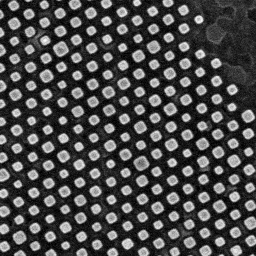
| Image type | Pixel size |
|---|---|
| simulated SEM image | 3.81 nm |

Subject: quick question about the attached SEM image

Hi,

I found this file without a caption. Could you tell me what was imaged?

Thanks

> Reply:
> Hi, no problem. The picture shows a regular array of raised bodies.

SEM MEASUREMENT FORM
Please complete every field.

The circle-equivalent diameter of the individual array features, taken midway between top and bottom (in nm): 36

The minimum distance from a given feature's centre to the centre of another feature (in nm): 66.7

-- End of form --